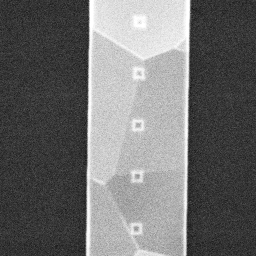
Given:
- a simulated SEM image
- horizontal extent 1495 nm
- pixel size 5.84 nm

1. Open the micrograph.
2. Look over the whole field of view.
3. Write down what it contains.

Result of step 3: wiring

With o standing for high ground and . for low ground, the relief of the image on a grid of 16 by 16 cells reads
......oooooo....
......oooooo....
......oooooo....
......oooooo....
......oooooo....
......oooooo....
......oooooo....
......oooooo....
......oooooo....
......oooooo....
......oooooo....
......oooooo....
......oooooo....
......oooooo....
......oooooo....
......oooooo....